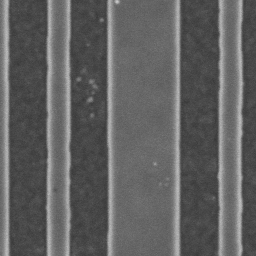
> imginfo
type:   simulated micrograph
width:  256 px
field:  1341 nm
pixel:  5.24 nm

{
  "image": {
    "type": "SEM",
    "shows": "lines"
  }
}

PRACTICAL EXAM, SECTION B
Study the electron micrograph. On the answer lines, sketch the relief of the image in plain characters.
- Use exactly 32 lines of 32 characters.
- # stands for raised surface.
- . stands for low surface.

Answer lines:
#.....###.....########......##..
#.....###.....########......##..
#.....###.....########.....###..
#.....###.....########.....###..
#.....###.....########......##..
#.....###.....########......##..
#.....###.....########......##..
#.....###.....########......##..
#.....###.....########......##..
#.....###.....########......##..
#.....###.....########......##..
#.....###.....########.....###..
#.....###.....########.....###..
#.....###.....########.....###..
#.....###.....########.....###..
#.....###.....########.....###..
#.....###....#########.....###..
#.....###.....########.....###..
#.....###.....########.....###..
#.....###.....########.....###..
#.....###.....########.....###..
#.....###.....########.....###..
#.....###.....########.....###..
#.....###.....########.....###..
#.....###.....########.....###..
#.....###.....########.....###..
#.....###.....########......##..
#.....###.....########.....###..
#.....###.....########.....###..
#.....###.....########.....###..
#.....###.....########.....###..
#.....###.....########.....###..